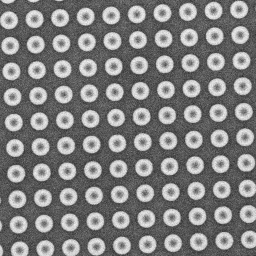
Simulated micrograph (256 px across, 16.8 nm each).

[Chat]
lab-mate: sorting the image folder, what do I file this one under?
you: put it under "an array of small figures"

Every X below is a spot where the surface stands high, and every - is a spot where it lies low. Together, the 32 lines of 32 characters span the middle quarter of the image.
XX--XXXX--XXXX---XXXX--XXXX---XX
XX--XXXX--XXXX---XXXX---XXX---XX
X----XXX---XXX------------------
--------------------------------
-------------------------X----XX
-----XX----XXX---XXXX---XXX---XX
XX--XXXX---XXXX--XXXX--XXXXX--XX
XX--XXXX---XXXX--XXXX---XXX---XX
XX--XXXX---XXX----XX-----X------
X-------------------------------
-------------------------------X
------------XX----XXX---XXXX--XX
XX---XXX---XXXX--XXXX---XXXX--XX
XX--XXXXX--XXXX--XXXX---XXXX--XX
XX---XXXX--XXXX---XXX---XXX----X
XX---XXX----X-------------------
--------------------------------
-------------------X-----XX----X
XX----XX----XXX---XXXX--XXXX--XX
XX---XXXX--XXXX---XXXX--XXXX--XX
XXX--XXXX--XXXX---XXXX--XXXX---X
XX---XXXX---XXX----XX-----------
X-------------------------------
--------------------------------
-------X----XXX---XXXX---XXX---X
XX---XXXX---XXXX--XXXX--XXXX---X
XXX--XXXX--XXXXX--XXXX---XXX---X
XXX--XXXX---XXX----XX----XX-----
XX----XX------------------------
--------------------------------
-------------------XX----XXX---X
XXX---XXX---XXXX--XXXX---XXXX--X